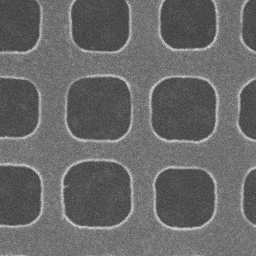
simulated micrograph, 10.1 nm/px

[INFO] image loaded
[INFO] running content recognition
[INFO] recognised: holes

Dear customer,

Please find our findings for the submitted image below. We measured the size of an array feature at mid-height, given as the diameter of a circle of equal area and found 691 nm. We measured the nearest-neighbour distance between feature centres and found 853 nanometers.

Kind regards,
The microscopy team